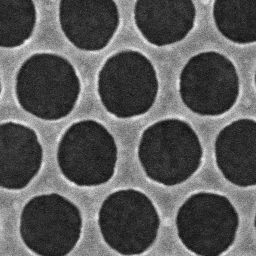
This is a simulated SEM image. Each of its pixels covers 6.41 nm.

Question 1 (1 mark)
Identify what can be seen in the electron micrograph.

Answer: holes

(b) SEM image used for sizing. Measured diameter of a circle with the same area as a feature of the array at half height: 412 nm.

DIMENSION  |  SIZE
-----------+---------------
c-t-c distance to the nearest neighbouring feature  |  502 nm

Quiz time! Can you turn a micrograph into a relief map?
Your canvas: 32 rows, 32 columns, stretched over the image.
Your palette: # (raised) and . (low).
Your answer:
....###.......###.......###.....
.....##........##.......###.....
....###........##.......###.....
....####.......##.......###.....
....####......####.....#####....
...######.....#####..###########
###############..#########.#####
###......####......#####.....###
##.......####......####......###
##........##........##........##
##........##........##........##
##........##........###.......##
##........###......####.......##
###......####......#####.....###
####....#######..###############
..#######....######.....#####...
....####......####......###.....
.....###......####.......##.....
.....##........##........##.....
.....##........##........##.....
.....##.......####.......##.....
.....###......####......####....
....#####.....#####....######...
...#############################
#####...######....######....####
###......####......####......###
###.......##........##........##
###.......##........##........##
##........###.......##........##
###.......###.......##.......###
###.......####.....####......###
####.....######...######....####